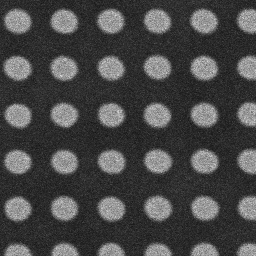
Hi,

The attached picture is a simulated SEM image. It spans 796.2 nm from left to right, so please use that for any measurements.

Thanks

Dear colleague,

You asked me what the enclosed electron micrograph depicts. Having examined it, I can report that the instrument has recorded a regular array of raised bodies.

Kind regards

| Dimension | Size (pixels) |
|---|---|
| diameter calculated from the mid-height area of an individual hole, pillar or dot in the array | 24.7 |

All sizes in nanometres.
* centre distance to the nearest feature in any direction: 145